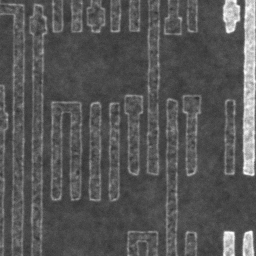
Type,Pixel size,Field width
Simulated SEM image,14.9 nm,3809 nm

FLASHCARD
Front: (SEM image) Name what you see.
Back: wiring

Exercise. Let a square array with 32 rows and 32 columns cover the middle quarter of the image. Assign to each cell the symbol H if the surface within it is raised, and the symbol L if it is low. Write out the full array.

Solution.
LLLLLLLLLLLLLLLLLLLLLHHHLLLLLLLL
LLLLLLLLLLLLLLLLLLLLLHHHLLLLLLLL
LLLLLLLLLLLLLLLLLLLLLHHHLLLLLLLL
LLLLLLLLLLLLLLLLLLLLLHHHLLLLLLLL
LLLLLLLLLLLLLLLLLLLLLHHHLLLLLLLL
LLLLLLLLLLLLLLLLLLLLLHHHLLLLLLLL
LLLLLLLLLLLLLLLLLLLLLHHLLLLLLLLL
LLLLLLLLLLLLLLLLLLLLLHHLLLLLLLLL
LLLLLLLLLLLLLLLHHHHLLHHLLLLLLLHH
LLLLLLLLLLLLLLLHHHHLLHHLLLHHLLHH
HHHHLLLHHLLLHHLHHHHLLHHLLLHHLLHH
HHHHLLLHHLLLHHLHHHHLLHHLLLHHLLHH
LLHHLLLHHLLLHHLLHHHLLHHLLLHHLLLH
LLHHLLLHHLLLHHLLHHHLLHHLLLHHLLLH
LLHHLLLHHLLLHHLLHHHLLHHLLLHHLLLH
LLHHLLLHHLLLHHLLHHHLLHHLLLHHLLLH
LLHHLLLHHLLLHHLLHHHLLHHLLLHHLLLH
LLHHLLLHHLLLHHLLHHHLLHHHLLHHLLLH
LLHHLLLHHLLLHHLLHHHLLHHLLLHHLLLH
LLHHLLLHHLLLHHLLHHHLLHHLLLHHLLLH
LLHHLLLHHLLLHHLLHHHLLHHLLLHHLLLH
LLHHLLLHHLLHHHLLHHHLLHHLLLHHLLLH
LLHHLLLHHLLHHHLLHHHLLHHLLLHHLLLH
LLHHLLLHHLLLHHLLHHHLLHHLLLHHLLLH
LLHHLLLHHLLLHHLLHHHLLHHLLLHHLLLH
LLHHLLLHHLLLHHLLHHHLLHHLLLHHLLLH
LLHHLLLHHLLLHHLLHHHLLHHLLLHHLLLH
LLHHLLLHHLLHHHLLLHLLLLLLLLHHLLLH
LLHHLLLHHLLHHHLLLLLLLLLLLLHHLLLL
LLHHLLHHHLLHHHLLLLLLLLLLLLHHLLLL
LLHHLLHHHLLLHHLLLLLLLLLLLLHHLLLL
LLHHLLHHHLLHHHLLLLLLLLLLLLHHLLLL